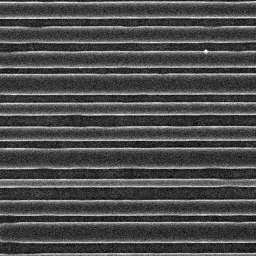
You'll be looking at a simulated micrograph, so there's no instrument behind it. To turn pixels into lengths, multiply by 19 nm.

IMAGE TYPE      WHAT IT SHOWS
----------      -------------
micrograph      groups of lines, slits or small figures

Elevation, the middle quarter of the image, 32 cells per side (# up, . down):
################################
................................
................................
################################
################################
################################
################################
########..########...##.........
................................
................................
################################
################################
################################
................................
................................
................................
################################
################################
################################
................................
................................
################################
################################
################################
################################
################################
................................
................................
................................
################################
################################
................................